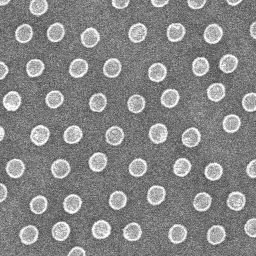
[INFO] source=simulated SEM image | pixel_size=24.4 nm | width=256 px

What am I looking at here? a regular array of raised bodies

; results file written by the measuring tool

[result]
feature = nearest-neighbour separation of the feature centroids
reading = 32.7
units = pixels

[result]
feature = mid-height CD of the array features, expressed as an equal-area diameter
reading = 17.8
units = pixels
